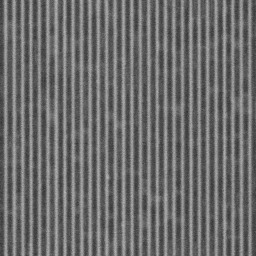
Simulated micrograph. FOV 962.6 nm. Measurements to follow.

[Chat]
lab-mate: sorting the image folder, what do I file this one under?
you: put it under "parallel lines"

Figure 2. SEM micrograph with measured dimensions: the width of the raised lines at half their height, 2.87 pixels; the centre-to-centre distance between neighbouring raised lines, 8.4 px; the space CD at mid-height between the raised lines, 0.0216 microns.